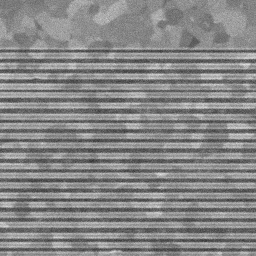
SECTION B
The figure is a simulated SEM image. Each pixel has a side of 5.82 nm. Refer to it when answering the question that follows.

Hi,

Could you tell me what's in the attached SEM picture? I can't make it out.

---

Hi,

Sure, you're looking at parallel lines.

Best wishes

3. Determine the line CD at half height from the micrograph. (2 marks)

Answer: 24.7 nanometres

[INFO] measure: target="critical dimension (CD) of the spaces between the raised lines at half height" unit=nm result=34.2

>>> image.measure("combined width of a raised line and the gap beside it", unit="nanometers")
58